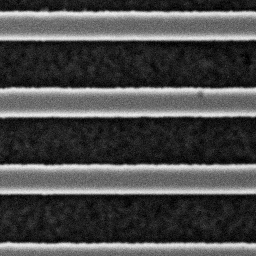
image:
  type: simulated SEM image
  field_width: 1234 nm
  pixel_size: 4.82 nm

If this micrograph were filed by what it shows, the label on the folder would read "lines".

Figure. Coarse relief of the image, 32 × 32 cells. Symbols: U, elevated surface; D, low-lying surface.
DDDDDDDDDDDDDDDDDDDDDDDDDDDDDDDD
DDDDDDDDDDDDDUDDDDDDDDDDDDDDDDDD
UUUUUUUUUUUUUUUUUUUUUUUUUUUUUUUU
UUUUUUUUUUUUUUUUUUUUUUUUUUUUUUUU
UUUUUUUUUUUUUUUUUUUUUUUUUUUUUUUU
DDDDDDDDDDDDDDDDDDDDDDDDDDDDDDDD
DDDDDDDDDDDDDDDDDDDDDDDDDDDDDDDD
DDDDDDDDDDDDDDDDDDDDDDDDDDDDDDDD
DDDDDDDDDDDDDDDDDDDDDDDDDDDDDDDD
DDDDDDDDDDDDDDDDDDDDDDDDDDDDDDDD
DDDDDDDDDDDDDDDDDDDDDDDDDDDDDDDD
UUUUUUUUUUUUUUUUUUUUUUUUUUUUUUUU
UUUUUUUUUUUUUUUUUUUUUUUUUUUUUUUU
UUUUUUUUUUUUUUUUUUUUUUUUUUUUUUUU
UDUUDDDDUUUDDDDUDDDDDDDDDUUDDDDD
DDDDDDDDDDDDDDDDDDDDDDDDDDDDDDDD
DDDDDDDDDDDDDDDDDDDDDDDDDDDDDDDD
DDDDDDDDDDDDDDDDDDDDDDDDDDDDDDDD
DDDDDDDDDDDDDDDDDDDDDDDDDDDDDDDD
DDDDDDDDDDDDDDDDDDDDDDDDDDDDDDDD
DDDDDDDDDDDDDDDDDDDDDDDDDDDDDDDD
UUUUUUUUUUUUUUUUUUUUUUUUUUUUUUUU
UUUUUUUUUUUUUUUUUUUUUUUUUUUUUUUU
UUUUUUUUUUUUUUUUUUUUUUUUUUUUUUUU
DDDDDDDDDDDDDDDDDDDDDDDDDDDDDDDD
DDDDDDDDDDDDDDDDDDDDDDDDDDDDDDDD
DDDDDDDDDDDDDDDDDDDDDDDDDDDDDDDD
DDDDDDDDDDDDDDDDDDDDDDDDDDDDDDDD
DDDDDDDDDDDDDDDDDDDDDDDDDDDDDDDD
DDDDDDDDDDDDDDDDDDDDDDDDDDDDDDDD
UUUUDDDUUDDDUUUUDUDUDUUUUUDUUUUD
UUUUUUUUUUUUUUUUUUUUUUUUUUUUUUUU